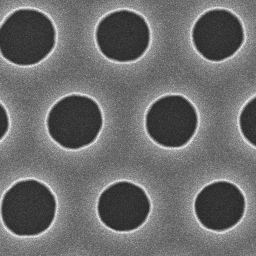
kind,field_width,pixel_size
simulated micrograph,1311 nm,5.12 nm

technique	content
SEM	holes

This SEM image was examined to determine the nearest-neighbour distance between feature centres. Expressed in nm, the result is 494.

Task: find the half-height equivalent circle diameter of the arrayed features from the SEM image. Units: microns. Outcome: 0.266